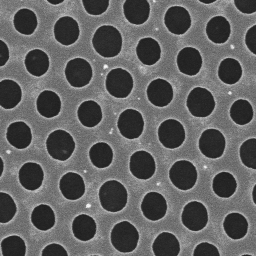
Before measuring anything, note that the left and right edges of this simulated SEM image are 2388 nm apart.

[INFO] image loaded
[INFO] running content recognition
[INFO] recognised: a regular array of holes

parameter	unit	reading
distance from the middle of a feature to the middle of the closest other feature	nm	392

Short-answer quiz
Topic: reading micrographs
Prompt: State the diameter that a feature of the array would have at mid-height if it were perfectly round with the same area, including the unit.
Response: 254 nanometres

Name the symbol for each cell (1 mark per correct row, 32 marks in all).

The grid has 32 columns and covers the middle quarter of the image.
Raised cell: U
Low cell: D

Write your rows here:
UDDDDDDUUUUUUUUUUUUUUUUUUUUUDDDD
DDDDDDDUUUUUDDDUUUUUUUUUUUUUUDDD
DDDDDDDUUUUDDDDDUUUUUUUUUUUUUUDD
UDDDDDDUUUUDDDDDDUUUUUUUUUUUUUUU
UDDDDDUUUUDDDDDDDUUUUUDDDDUUUUUU
UUDDDUUUUUDDDDDDDUUUUDDDDDDUUUUU
UUUUUUUUUUUDDDDDDUUUUDDDDDDUUUUU
UUUUUUUUUUUDDDDDUUUUUDDDDDDUUUUD
UUUUUUUUUUUUUDDUUUUUUDDDDDDUUUUD
UUUUUDDDUUUUUUUUUUUUUUDDDDDUUUDD
UUUUDDDDDUUUUUUUUUUUUUUDDUUUUUUD
UUUDDDDDDUUUUUUDDDUUUUUUUUUUUUUD
UUUDDDDDDDUUUUDDDDDUUUUUUUUUUUUU
UUUDDDDDDUUUUUDDDDDDUUUUUUUUUUUU
UUUUDDDDDUUUUDDDDDDDUUUUUDDDDUUU
UUUUUDDDUUUUUDDDDDDDUUUUDDDDDDUU
UUUUUUUUUUUUUUDDDDDDUUUDDDDDDDUU
DUUUUUUUUUUUUUDDDDDUUUUDDDDDDDUU
DDUUUUUUUUUUUUUDDDUUUUUUDDDDDDUU
DDDUUUUUUUUUUUUUUUUUUUUUDDDDDDUU
DDDUUUUDDDDUUUUUUUUUUUUUUDDDDUUU
DDDUUUDDDDDDUUUUUUUUUUUUUUUUUUUU
DDUUUUDDDDDDUUUUUDDDDUUUUUUUUUUU
DUUUUUDDDDDDUUUUUDDDDDUUUUUUUUUU
UUUUUUUDDDDDUUUUDDDDDDDUUUUUDDDD
UUUUUUUUDDDUUUUUDDDDDDDUUUUDDDDD
UUUUUUUUUUUUUUUUDDDDDDDUUUDDDDDD
DDDUUUUUUUUUUUUUUDDDDDUUUUDDDDDD
DDDDUUUUUUUUUUUUUUDDDDUUUUDDDDDD
DDDDDUUUUUDDDDUUUUUUUUUUUUUDDDDD
DDDDDUUUUDDDDDDUUUUUUUUUUUUUDDDD
DDDDDUUUUDDDDDDDUUUUUUUUUUUUUDDU